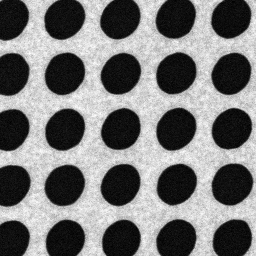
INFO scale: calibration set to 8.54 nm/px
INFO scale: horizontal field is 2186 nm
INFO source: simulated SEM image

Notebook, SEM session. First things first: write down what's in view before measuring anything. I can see a regular array of holes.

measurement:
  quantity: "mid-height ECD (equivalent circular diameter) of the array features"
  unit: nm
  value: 348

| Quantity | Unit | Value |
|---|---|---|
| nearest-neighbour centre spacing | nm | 472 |